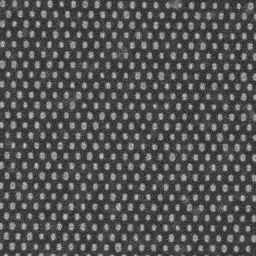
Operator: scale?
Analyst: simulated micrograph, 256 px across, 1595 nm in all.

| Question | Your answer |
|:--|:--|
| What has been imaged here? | a regular array of raised bodies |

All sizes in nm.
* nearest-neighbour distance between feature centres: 71.1